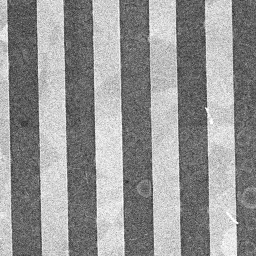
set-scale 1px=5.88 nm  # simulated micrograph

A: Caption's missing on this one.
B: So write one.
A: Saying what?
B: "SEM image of parallel lines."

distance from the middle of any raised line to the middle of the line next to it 330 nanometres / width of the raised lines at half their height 0.155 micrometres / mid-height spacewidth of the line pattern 175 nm